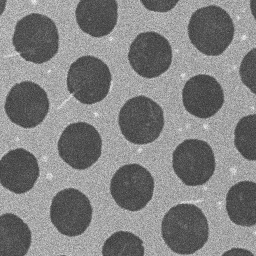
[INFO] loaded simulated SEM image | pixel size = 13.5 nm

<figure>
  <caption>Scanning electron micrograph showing a regular array of holes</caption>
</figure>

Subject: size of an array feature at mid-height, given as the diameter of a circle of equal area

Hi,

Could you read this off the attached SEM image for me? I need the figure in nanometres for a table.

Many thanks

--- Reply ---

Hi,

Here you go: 621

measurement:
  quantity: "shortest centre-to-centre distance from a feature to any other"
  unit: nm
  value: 894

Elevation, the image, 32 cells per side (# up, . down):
.#########.....###....#########.
#########......#####.###....###.
##....####.....#########.....###
##.....###....#########......###
##.....####..####...####.....###
##.....#########.....###.....###
##.....#########.....####...###.
###...###....###.....#########..
#########.....###....#########..
########......####..####..####..
##...###......#########....###..
#.....###.....#########.....###.
#.....####...###...####.....####
#.....#########.....###.....####
#.....#########.....####...####.
##...####..####......#########..
########....###.....#########...
#######......###...####..####...
#######......#########....###...
....###......#########.....###..
.....###....####.####......#####
.....#########.....###.....#####
.....#########.....####...######
#...##########.....##########...
#######....###.....#########....
######.....####...####..####....
######......#########....###....
...###.....#########......###...
....###....#########......######
....####.#####...###......######
....#########.....###.....######
...##########.....####..####...#